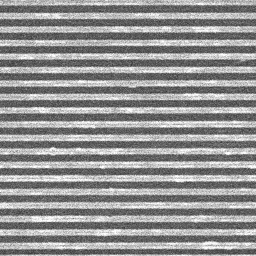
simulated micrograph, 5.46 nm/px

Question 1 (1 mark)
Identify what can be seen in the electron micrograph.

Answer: parallel lines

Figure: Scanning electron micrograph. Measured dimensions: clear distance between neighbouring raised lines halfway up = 42.4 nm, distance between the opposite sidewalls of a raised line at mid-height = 5.75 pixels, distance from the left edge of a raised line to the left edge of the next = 0.0739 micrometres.